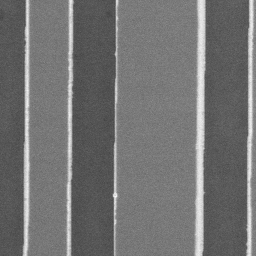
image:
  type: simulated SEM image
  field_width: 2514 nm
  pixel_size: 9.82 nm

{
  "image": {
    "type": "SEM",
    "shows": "lines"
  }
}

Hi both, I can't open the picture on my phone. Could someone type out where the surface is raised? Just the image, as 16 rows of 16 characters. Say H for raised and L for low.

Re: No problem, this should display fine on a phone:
LLHHLLLHHHHHHLLL
LLHHLLLHHHHHHLLL
LLHHLLLHHHHHHLLL
LLHHLLLHHHHHHLLL
LLHHLLLHHHHHHLLL
LLHHLLLHHHHHHLLL
LLHHLLLHHHHHHLLL
LLHHLLLHHHHHHLLL
LLHHLLLHHHHHHLLL
LLHHLLLHHHHHHLLL
LLHHLLLHHHHHHLLL
LLHHLLLHHHHHHLLL
LLHHLLLHHHHHHLLL
LLHHLLLHHHHHHLLL
LLHHLLLHHHHHHLLL
LLHHLLLHHHHHHLLL